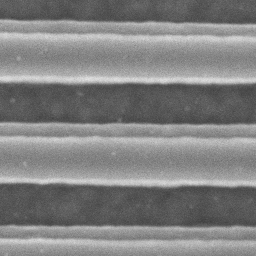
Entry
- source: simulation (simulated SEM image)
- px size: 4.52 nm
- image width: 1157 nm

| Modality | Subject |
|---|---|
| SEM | lines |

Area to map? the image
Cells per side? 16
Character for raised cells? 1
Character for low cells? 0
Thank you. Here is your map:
0000000000000000
1111111111000000
1111111111111111
1111111111111111
1111111111111111
0000000000000000
0000000000000000
0000000000000000
1111111111111111
1111111111111111
1111111111111111
0000000011111111
0000000000000000
0000000000000000
1111111111111111
1111111111111111